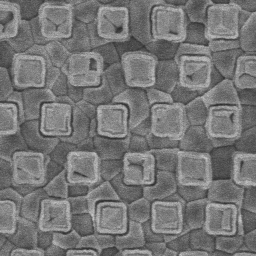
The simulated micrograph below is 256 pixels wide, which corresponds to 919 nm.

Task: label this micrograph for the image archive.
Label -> a regular array of raised bodies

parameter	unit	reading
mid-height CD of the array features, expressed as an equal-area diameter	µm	0.117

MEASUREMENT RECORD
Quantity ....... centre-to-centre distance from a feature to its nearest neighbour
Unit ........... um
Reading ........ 0.117